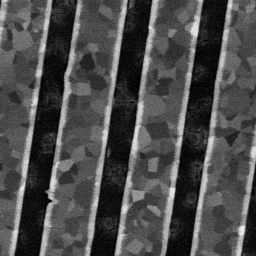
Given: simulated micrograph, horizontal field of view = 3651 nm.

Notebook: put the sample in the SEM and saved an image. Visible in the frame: one or a few lines or trenches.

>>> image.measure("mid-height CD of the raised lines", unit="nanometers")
652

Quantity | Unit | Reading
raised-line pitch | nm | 1060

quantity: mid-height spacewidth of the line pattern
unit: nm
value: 406